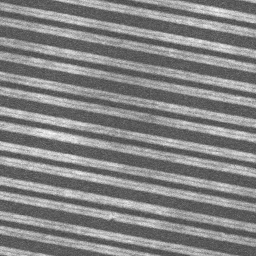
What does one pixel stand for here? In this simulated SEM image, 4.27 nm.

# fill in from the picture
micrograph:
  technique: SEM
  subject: parallel lines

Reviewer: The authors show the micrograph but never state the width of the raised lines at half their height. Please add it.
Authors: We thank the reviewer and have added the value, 0.0315 microns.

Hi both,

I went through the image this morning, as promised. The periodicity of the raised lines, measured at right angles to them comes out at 17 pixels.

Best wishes